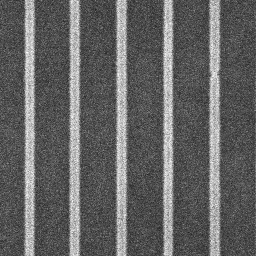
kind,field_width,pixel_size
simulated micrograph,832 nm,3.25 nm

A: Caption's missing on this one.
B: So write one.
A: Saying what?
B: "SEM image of parallel lines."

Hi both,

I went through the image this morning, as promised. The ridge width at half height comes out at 25.6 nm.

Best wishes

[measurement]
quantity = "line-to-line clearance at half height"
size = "125 nm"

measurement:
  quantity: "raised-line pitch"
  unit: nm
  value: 151